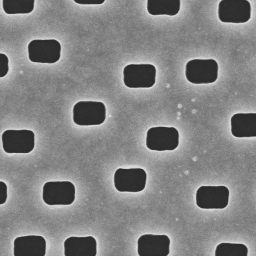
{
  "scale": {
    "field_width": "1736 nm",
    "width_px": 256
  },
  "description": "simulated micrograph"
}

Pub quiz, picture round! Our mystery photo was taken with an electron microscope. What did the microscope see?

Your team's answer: a regular array of holes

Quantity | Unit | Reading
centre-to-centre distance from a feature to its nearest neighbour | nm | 425